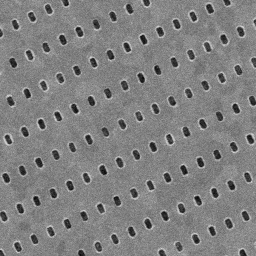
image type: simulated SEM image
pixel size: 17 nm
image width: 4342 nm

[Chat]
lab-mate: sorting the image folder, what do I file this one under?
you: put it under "a regular array of holes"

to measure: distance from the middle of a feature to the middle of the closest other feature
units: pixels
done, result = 18.2